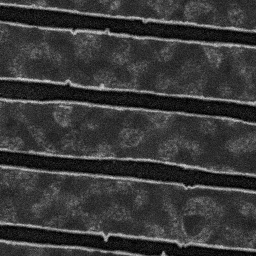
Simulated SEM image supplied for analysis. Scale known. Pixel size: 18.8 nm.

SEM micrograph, one or a few lines or trenches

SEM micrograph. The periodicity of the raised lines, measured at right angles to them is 1350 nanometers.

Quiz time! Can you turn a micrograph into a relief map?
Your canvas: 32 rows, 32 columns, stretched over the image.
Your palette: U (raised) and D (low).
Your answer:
UUUUUUUUUUUUUUUUUUUUUUUUUUUUUUUU
DDDDDDDDDUUUUUUUUUUUUUUUUUUUUUUU
DDDDDDDDDDDDDDDDDDUUUUUUUUUUUUUU
UUUUUDDDDDDDDDDDDDDDDDDDDDDDUUUU
UUUUUUUUUUUUUUUUDDDDDDDDDDDDDDDD
UUUUUUUUUUUUUUUUUUUUUUUUUUDDDDDD
UUUUUUUUUUUUUUUUUUUUUUUUUUUUUUUU
UUUUUUUUUUUUUUUUUUUUUUUUUUUUUUUU
UUUUUUUUUUUUUUUUUUUUUUUUUUUUUUUU
UUUUUUUUUUUUUUUUUUUUUUUUUUUUUUUU
DDDDDDDDDUUUUUUUUUUUUUUUUUUUUUUU
DDDDDDDDDDDDDDDDDDDUUUUUUUUUUUUU
UDDDDDDDDDDDDDDDDDDDDDDDDDDDUUUU
UUUUUUUUUUUUUUDDDDDDDDDDDDDDDDDD
UUUUUUUUUUUUUUUUUUUUUUUUUDDDDDDD
UUUUUUUUUUUUUUUUUUUUUUUUUUUUUUUU
UUUUUUUUUUUUUUUUUUUUUUUUUUUUUUUU
UUUUUUUUUUUUUUUUUUUUUUUUUUUUUUUU
UUUUUUUUUUUUUUUUUUUUUUUUUUUUUUUU
DDDDDDDDUUUUUUUUUUUUUUUUUUUUUUUU
DDDDDDDDDDDDDDDDDDDDDDUUUUUUUUUU
UUUUUUDDDDDDDDDDDDDDDDDDDDDUUUUU
UUUUUUUUUUUUUUUUUDDDDDDDDDDDDDDD
UUUUUUUUUUUUUUUUUUUUUUUUUUDDDDDD
UUUUUUUUUUUUUUUUUUUUUUUUUUUUUUUU
UUUUUUUUUUUUUUUUUUUUUUUUUUUUUUUU
UUUUUUUUUUUUUUUUUUUUUUUUUUUUUUUU
UUUUUUUUUUUUUUUUUUUUUUUUUUUUUUUU
DDDDDDUUUUUUUUUUUUUUUUUUUUUUUUUU
DDDDDDDDDDDDDUDUUUUUUUUUUUUUUUUU
UUUDDDDDDDDDDDDDDDDDDDUUUUUUUUUU
UUUUUUUUUUUUUDDDDDDDDDDDDDDDDDDD